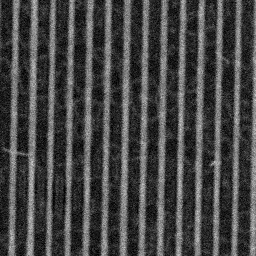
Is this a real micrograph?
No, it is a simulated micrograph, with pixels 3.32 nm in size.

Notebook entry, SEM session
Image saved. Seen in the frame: parallel lines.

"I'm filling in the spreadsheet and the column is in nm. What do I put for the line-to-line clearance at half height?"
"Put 43.2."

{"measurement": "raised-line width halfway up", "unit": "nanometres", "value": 18.3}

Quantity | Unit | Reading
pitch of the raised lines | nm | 61.6